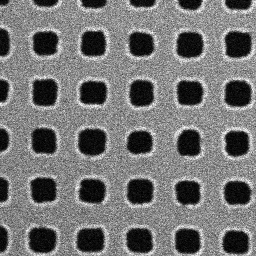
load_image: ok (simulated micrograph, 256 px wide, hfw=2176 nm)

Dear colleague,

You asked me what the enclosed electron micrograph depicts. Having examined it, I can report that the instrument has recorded a regular array of holes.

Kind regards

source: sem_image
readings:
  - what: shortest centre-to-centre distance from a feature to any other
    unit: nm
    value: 408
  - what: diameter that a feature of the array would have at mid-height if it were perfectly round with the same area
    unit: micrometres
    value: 0.231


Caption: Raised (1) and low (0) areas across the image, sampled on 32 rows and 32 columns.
01110001110001110001110001110001
11111111111111111111111111111111
11111111111111111111111111111111
11111111111111111111111111111111
01110001110001110001110001110001
01110001110001110001110001110001
01110001110001110001110001110001
11111111111111111111111111111111
11111111111111111111111111111111
11111111111111111111111111111111
01110001110001110001110001110001
01110001110001110001110001110001
01110001110001110001110001110001
11111111111111111111111111111111
11111111111111111111111111111111
11111111111111111111111111111111
01110001110001111011111001111001
01110001110001110001110001110001
01110001110001110001110001110001
11111111111111111111111011111011
11111111111111111111111111111111
11111111111111111111111111111111
01110001110011111001111111111111
01110001110001110001110001110001
01110001110001110001110001110001
11111111111111111011111011111001
11111111111111111111111111111111
11111111111111111111111111111111
11110011111011111111111111111111
01110001110001110001110001110001
01110001110001110001110001110001
11111011111111111001110001110001